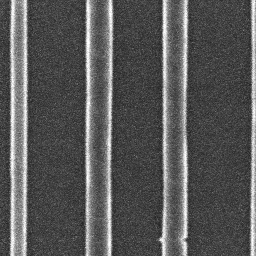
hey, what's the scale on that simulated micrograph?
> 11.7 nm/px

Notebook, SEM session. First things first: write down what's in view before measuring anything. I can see one or a few lines or trenches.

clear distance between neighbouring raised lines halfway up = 0.72 um